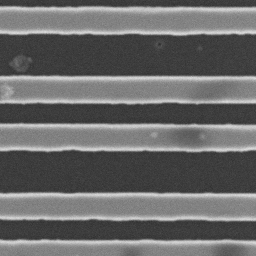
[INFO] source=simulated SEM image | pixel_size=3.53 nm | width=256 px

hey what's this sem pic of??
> lines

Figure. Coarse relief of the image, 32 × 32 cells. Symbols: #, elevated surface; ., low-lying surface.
................................
################################
################################
################################
................................
................................
................................
................................
................................
................................
################################
################################
################################
................................
................................
................................
################################
################################
################################
................................
................................
................................
................................
................................
################################
################################
################################
..............##....##....######
................................
................................
################################
################################